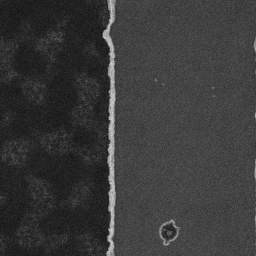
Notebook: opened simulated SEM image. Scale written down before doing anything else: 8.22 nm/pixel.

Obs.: one or a few lines or trenches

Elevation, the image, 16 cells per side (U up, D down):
UUUUUUUDDDDDDDDD
UUUUUUUDDDDDDDDD
UUUUUUUDDDDDDDDD
UUUUUUUDDDDDDDDD
UUUUUUUDDDDDDDDD
UUUUUUUDDDDDDDDD
UUUUUUUDDDDDDDDD
UUUUUUUDDDDDDDDD
UUUUUUUDDDDDDDDD
UUUUUUUDDDDDDDDD
UUUUUUUDDDDDDDDD
UUUUUUUDDDDDDDDD
UUUUUUUDDDDDDDDD
UUUUUUUDDDDDDDDD
UUUUUUUDDDDDDDDD
UUUUUUUDDDDDDDDD